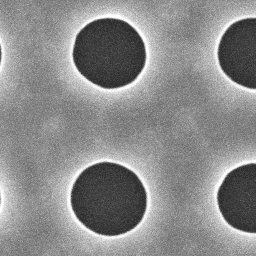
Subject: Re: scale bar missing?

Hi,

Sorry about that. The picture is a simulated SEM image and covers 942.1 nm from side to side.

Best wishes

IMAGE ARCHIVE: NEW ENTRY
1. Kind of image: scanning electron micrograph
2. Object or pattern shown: holes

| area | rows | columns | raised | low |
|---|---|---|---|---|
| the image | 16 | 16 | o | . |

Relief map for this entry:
oooooooooooooooo
ooooo...ooooooo.
ooooo....ooooo..
ooooo....ooooo..
ooooo....ooooo..
oooooo..ooooooo.
oooooooooooooooo
oooooooooooooooo
oooooooooooooooo
oooooooooooooooo
ooooo...ooooooo.
ooooo....ooooo..
oooo.....ooooo..
ooooo....ooooo..
oooooo..ooooooo.
oooooooooooooooo